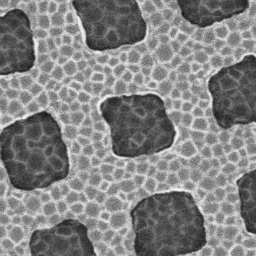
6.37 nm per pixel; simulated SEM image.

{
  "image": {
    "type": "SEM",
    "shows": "holes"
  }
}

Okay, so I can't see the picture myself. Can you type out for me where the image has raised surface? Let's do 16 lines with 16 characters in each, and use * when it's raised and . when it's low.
*****....**....*
..***....***.***
..***....*******
..*************.
..************..
*************...
******....***...
*..****....**...
....***....*****
....***...******
....************
*..************.
*********...***.
********.....**.
**...***.....***
**....**.....***